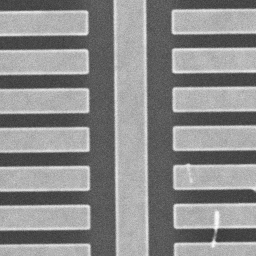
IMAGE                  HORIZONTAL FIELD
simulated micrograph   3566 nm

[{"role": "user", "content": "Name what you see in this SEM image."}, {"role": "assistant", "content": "groups of lines, slits or small figures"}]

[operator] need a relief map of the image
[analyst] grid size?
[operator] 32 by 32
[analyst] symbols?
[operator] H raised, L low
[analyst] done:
LLLLLLLLLLLLLLHHHHLLLLLLLLLLLLLL
HHHHHHHHHHHLLLHHHHLLLLHHHHHHHHHH
HHHHHHHHHHHLLLHHHHLLLLHHHHHHHHHH
HHHHHHHHHHHLLLHHHHLLLLHHHHHHHHHH
LLLLLLLLLLLLLLHHHHLLLLLLLLLLLLLL
LLLLLLLLLLLLLLHHHHLLLLLLLLLLLLLL
HHHHHHHHHHHLLLHHHHLLLLHHHHHHHHHH
HHHHHHHHHHHLLLHHHHLLLLHHHHHHHHHH
HHHHHHHHHHHLLLHHHHLLLLHHHHHHHHHH
LLLLLLLLLLLLLLHHHHLLLLLLLLLLLLLL
LLLLLLLLLLLLLLHHHHLLLLLLLLLLLLLL
HHHHHHHHHHHLLLHHHHLLLLHHHHHHHHHH
HHHHHHHHHHHLLLHHHHLLLLHHHHHHHHHH
HHHHHHHHHHHLLLHHHHLLLLHHHHHHHHHH
LLLLLLLLLLLLLLHHHHLLLLLLLLLLLLLL
LLLLLLLLLLLLLLLHHHLLLLLLLLLLLLLL
HHHHHHHHHHHLLLLHHHLLLLHHHHHHHHHH
HHHHHHHHHHHLLLLHHHLLLLHHHHHHHHHH
HHHHHHHHHHHLLLLHHHLLLLHHHHHHHHHH
LLLLLLLLLLLLLLLHHHLLLLLLLLLLLLLL
LLLLLLLLLLLLLLLHHHLLLLLLLLLLLLLL
HHHHHHHHHHHLLLLHHHLLLLHHHHHHHHHH
HHHHHHHHHHHLLLLHHHLLLLHHHHHHHHHH
HHHHHHHHHHHLLLLHHHLLLLHHHHHHHHHH
LLLLLLLLLLLLLLLHHHLLLLLLLLLLLLLL
LLLLLLLLLLLLLLLHHHLLLLLLLLLLLHHH
HHHHHHHHHHHLLLLHHHLLLLHHHHHHHHHH
HHHHHHHHHHHLLLLHHHLLLLHHHHHHHHHH
HHHHHHHHHHHLLLLHHHLLLLLLLLHHLLLL
LLLLLLLLLLLLLLLHHHLLLLLLLLLLLLLL
LLLLLLLLLLLLLLLHHHLLLLHHHHHHHHHH
HHHHHHHHHHHLLLLHHHLLLLHHHHHHHHHH